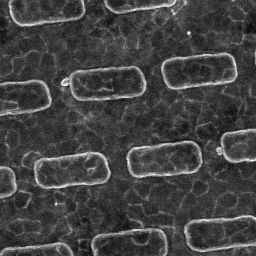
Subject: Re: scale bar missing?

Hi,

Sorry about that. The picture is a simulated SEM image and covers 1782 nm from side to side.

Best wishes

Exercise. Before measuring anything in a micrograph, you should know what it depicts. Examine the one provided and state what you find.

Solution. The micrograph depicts raised bodies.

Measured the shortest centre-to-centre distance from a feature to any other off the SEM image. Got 93.6 px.